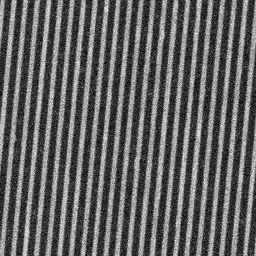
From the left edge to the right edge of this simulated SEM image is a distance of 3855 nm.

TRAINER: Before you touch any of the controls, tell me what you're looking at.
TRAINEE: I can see parallel lines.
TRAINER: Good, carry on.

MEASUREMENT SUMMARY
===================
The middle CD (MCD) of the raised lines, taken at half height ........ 3.73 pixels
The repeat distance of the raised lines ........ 11.5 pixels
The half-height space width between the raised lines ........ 122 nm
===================